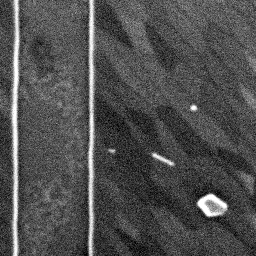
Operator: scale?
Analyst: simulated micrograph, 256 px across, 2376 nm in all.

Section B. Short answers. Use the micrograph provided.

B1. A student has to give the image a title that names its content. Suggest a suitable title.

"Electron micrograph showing wiring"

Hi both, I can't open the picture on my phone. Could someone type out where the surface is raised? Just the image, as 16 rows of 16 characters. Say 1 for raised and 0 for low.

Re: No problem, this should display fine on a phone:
1000001111111111
1000001111111111
1000001111111111
1000001111111111
1000001111111111
1000001111111111
1000001111111111
1000001111111111
1000001111111111
1000001111111111
1000001111111111
1000001111111111
1000001111111111
1000001111111111
1000001111111111
1000001111111111